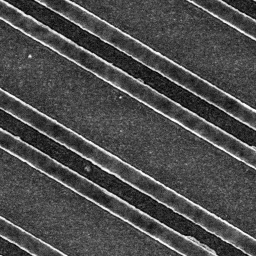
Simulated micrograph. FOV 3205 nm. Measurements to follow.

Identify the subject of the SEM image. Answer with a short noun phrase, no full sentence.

lines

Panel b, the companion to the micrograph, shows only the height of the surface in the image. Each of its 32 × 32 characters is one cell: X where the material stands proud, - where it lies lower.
X----XXXX---------------XXXX----
XXX----XXXX---------------XXXX--
XXXX-----XXXX---------------XXXX
--XXXX----XXXX---------------XXX
----XXXX----XXXX---------------X
-----XXXX-----XXXX--------------
-------XXXX----XXXXX------------
---------XXXX----XXXX-----------
----------XXXXX----XXXX---------
------------XXXX----XXXXX-------
--------------XXXX----XXXX------
X---------------XXXX----XXXX----
XXX--------------XXXX-----XXXX--
XXXX---------------XXXX----XXXX-
--XXXX---------------XXXX----XXX
---XXXX---------------XXXX-----X
X----XXXX---------------XXXX----
XXX----XXXX---------------XXXX--
XXXX-----XXXX--------------XXXXX
--XXXX----XXXX---------------XXX
----XXXX----XXXX---------------X
-----XXXX-----XXXX--------------
-------XXXX----XXXX-------------
---------XXXX----XXXX-----------
----------XXXX-----XXXX---------
------------XXXX----XXXX--------
--------------XXXX----XXXX------
X---------------XXXX----XXXX----
XXX--------------XXXX----XXXXX--
XXXX---------------XXXX----XXXX-
--XXXX--------------XXXXX----XXX
---XXXXX--------------XXXX----XX